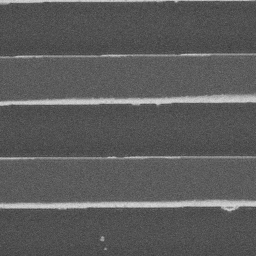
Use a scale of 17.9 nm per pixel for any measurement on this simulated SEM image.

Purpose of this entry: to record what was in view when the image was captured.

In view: lines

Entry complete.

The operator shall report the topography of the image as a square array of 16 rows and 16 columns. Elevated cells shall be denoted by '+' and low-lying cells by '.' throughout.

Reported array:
................
................
................
......++++++++++
++++++++++++++++
++++++++++++++++
................
................
................
................
++++++++++++++++
++++++++++++++++
++++++++++++++++
................
................
................